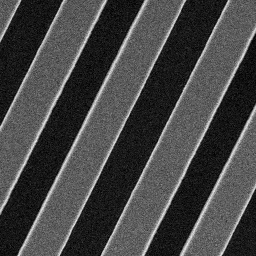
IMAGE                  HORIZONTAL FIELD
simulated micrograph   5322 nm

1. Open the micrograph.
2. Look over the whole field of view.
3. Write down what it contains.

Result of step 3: lines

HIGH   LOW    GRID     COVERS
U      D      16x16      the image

UDDDUUDDDUUDDDUU
UDDUUUDDUUUDDDUU
DDDUUDDDUUDDDUUU
DDUUUDDUUUDDDUUD
DDUUDDDUUDDDUUUD
DUUUDDUUUDDDUUDD
DUUDDDUUDDDUUUDD
UUUDDUUUDDDUUDDD
UUDDDUUDDDUUUDDU
UUDDUUUDDDUUDDDU
UDDDUUDDDUUUDDUU
UDDUUUDDDUUDDDUU
DDDUUDDDUUUDDUUU
DDUUUDDDUUDDDUUD
DDUUDDDUUUDDUUUD
DUUUDDDUUDDDUUDD